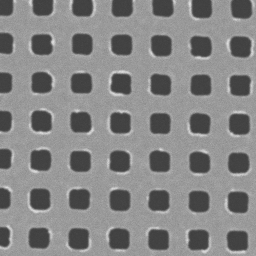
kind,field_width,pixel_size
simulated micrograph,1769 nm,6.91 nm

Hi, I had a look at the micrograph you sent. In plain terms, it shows a regular array of holes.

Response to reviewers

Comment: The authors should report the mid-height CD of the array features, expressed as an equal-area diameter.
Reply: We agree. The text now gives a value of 158 nanometers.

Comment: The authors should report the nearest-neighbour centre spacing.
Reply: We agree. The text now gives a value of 0.267 micrometres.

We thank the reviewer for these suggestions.